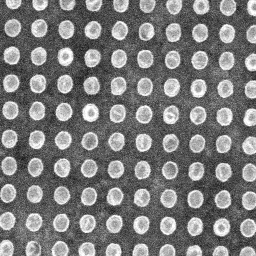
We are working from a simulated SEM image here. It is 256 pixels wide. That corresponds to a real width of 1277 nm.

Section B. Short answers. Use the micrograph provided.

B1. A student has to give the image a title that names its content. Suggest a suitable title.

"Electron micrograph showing a regular array of raised bodies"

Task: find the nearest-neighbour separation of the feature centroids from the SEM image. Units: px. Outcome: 26.7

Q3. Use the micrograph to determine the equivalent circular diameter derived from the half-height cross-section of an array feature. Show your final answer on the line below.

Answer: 80.8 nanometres